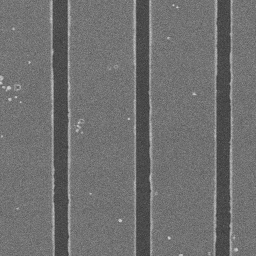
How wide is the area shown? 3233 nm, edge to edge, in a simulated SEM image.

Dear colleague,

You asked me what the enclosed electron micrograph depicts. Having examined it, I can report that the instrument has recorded lines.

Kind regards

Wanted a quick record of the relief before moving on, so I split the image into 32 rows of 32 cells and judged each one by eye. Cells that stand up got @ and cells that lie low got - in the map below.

@@@@@@---@@@@@@@@--@@@@@@@@--@@@
@@@@@@---@@@@@@@@--@@@@@@@@--@@@
@@@@@@---@@@@@@@@--@@@@@@@@--@@@
@@@@@@---@@@@@@@@--@@@@@@@@--@@@
@@@@@@---@@@@@@@@--@@@@@@@@--@@@
@@@@@@---@@@@@@@@--@@@@@@@@--@@@
@@@@@@---@@@@@@@@--@@@@@@@@--@@@
@@@@@@---@@@@@@@@--@@@@@@@@--@@@
@@@@@@---@@@@@@@@--@@@@@@@@--@@@
@@@@@@@--@@@@@@@@--@@@@@@@@--@@@
@@@@@@@--@@@@@@@@--@@@@@@@@--@@@
@@@@@@@--@@@@@@@@--@@@@@@@@--@@@
@@@@@@@--@@@@@@@@--@@@@@@@@--@@@
@@@@@@@--@@@@@@@@--@@@@@@@@--@@@
@@@@@@@--@@@@@@@@--@@@@@@@@--@@@
@@@@@@@--@@@@@@@@--@@@@@@@@--@@@
@@@@@@@--@@@@@@@@--@@@@@@@@--@@@
@@@@@@@--@@@@@@@@--@@@@@@@@--@@@
@@@@@@@--@@@@@@@@--@@@@@@@@--@@@
@@@@@@@--@@@@@@@@--@@@@@@@@--@@@
@@@@@@@--@@@@@@@@--@@@@@@@@--@@@
@@@@@@@--@@@@@@@@--@@@@@@@@--@@@
@@@@@@@--@@@@@@@@--@@@@@@@@--@@@
@@@@@@@--@@@@@@@@--@@@@@@@@--@@@
@@@@@@@--@@@@@@@@--@@@@@@@@--@@@
@@@@@@@--@@@@@@@@--@@@@@@@@--@@@
@@@@@@@--@@@@@@@@--@@@@@@@@--@@@
@@@@@@@--@@@@@@@@--@@@@@@@@--@@@
@@@@@@@--@@@@@@@@--@@@@@@@@--@@@
@@@@@@@--@@@@@@@@--@@@@@@@@--@@@
@@@@@@@--@@@@@@@@--@@@@@@@@--@@@
@@@@@@@--@@@@@@@@--@@@@@@@@--@@@